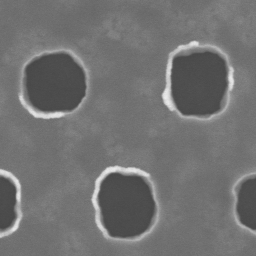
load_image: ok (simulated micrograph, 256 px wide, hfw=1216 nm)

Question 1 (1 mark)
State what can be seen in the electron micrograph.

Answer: holes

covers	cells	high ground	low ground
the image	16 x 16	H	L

HHHHHHHHHHHHHHHH
HHHHHHHHHHHHHHHH
HHHHHHHHHHHHHHHH
HHLLHHHHHHHLLLHH
HLLLLHHHHHHLLLHH
HLLLLHHHHHHLLLHH
HHLLLHHHHHHLLLHH
HHHHHHHHHHHHHHHH
HHHHHHHHHHHHHHHH
HHHHHHHHHHHHHHHH
HHHHHHHHHHHHHHHH
LHHHHHLLLHHHHHHL
LHHHHHLLLLHHHHHL
LHHHHHLLLLHHHHHL
HHHHHHHLLHHHHHHH
HHHHHHHHHHHHHHHH